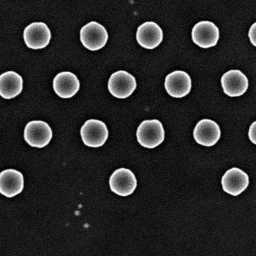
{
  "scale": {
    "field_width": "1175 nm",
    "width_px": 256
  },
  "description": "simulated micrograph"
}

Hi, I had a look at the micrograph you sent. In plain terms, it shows a regular array of raised bodies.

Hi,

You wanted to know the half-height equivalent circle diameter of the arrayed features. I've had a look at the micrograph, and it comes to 120 nanometres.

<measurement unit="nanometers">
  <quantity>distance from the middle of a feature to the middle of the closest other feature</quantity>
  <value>257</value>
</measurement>